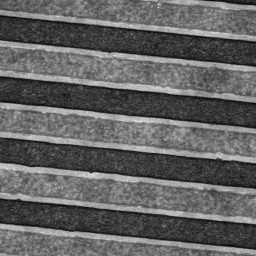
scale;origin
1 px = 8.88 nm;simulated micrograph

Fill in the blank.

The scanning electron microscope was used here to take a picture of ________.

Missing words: parallel lines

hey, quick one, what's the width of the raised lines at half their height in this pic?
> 266 nanometres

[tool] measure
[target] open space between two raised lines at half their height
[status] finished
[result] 0.275 µm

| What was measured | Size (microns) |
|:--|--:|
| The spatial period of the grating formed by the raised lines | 0.539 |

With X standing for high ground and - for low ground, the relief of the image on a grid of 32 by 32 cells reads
XXXXXXXXXXXXXXXXXXXXXXXXXXX-----
XXXXXXXXXXXXXXXXXXXXXXXXXXXXXXXX
---------XXXXXXXXXXXXXXXXXXXXXXX
-------------------XXXXXXXXXXXXX
----------------------------XXXX
X-------------------------------
XXXXXXXXXX----------------------
XXXXXXXXXXXXXXXXXXXX------------
XXXXXXXXXXXXXXXXXXXXXXXXXXXXXX--
----XXXXXXXXXXXXXXXXXXXXXXXXXXXX
-------------XXXXXXXXXXXXXXXXXXX
----------------------XXXXXXXXXX
--------------------------------
XXX-----------------------------
XXXXXXXXXXXXX-------------------
XXXXXXXXXXXXXXXXXXXXXXX---------
XXXXXXXXXXXXXXXXXXXXXXXXXXXXXXXX
-------XXXXXXXXXXXXXXXXXXXXXXXXX
-----------------XXXXXXXXXXXXXXX
--------------------------X-XXXX
--------------------------------
XXXXXXXX------------------------
XXXXXXXXXXXXXXXXX---------------
XXXXXXXXXXXXXXXXXXXXXXXXXXX-----
XXXXXXXXXXXXXXXXXXXXXXXXXXXXXXXX
----------XXXXXXXXXXXXXXXXXXXXXX
---------------------XXXXXXXXXXX
-------------------------------X
XX------------------------------
XXXXXXXXXXXX--------------------
XXXXXXXXXXXXXXXXXXXXXX----------
XXXXXXXXXXXXXXXXXXXXXXXXXXXXXXX-